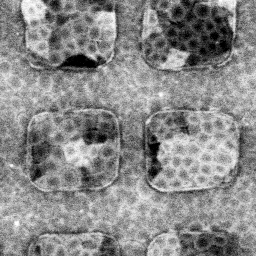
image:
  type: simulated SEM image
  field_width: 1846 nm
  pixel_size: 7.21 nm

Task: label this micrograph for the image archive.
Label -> raised bodies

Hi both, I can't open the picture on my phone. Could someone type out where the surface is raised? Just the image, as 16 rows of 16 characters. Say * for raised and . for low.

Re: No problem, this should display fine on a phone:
.******..******.
..*****..******.
..*****..******.
..*****..*****..
................
................
................
..*****..******.
..*****..******.
..*****..******.
..*****..******.
..*****..*****..
................
................
................
..*****..******.